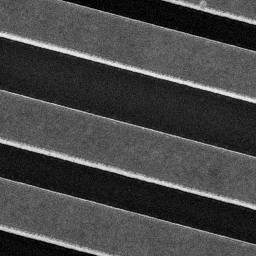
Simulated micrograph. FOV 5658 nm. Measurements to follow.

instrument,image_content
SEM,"lines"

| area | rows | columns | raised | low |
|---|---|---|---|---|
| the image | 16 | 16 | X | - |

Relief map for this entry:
XXXXXX------XXXX
XXXXXXXXX-------
-XXXXXXXXXXXX---
-----XXXXXXXXXXX
---------XXXXXXX
------------XXXX
XXX-------------
XXXXXXX---------
XXXXXXXXXXX-----
--XXXXXXXXXXXXX-
------XXXXXXXXXX
XX--------XXXXXX
XXXXX---------XX
XXXXXXXXX-------
-XXXXXXXXXXXX---
----XXXXXXXXXXXX